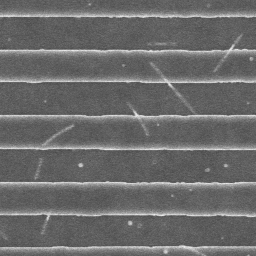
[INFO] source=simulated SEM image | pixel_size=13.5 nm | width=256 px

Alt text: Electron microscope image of lines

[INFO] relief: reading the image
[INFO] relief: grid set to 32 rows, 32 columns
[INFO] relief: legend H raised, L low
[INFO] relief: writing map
HHHHHHHHHHHHHHHHHHHHHHHHHHHHHHHH
HHHHHHHHHHHHHHHHHHHHHHHHHHHHHHHH
LLLLLLLLLLLLLLLLLLLLLLLLLLLLLLLL
LLLLLLLLLLLLLLLLLLLLLLLLLLLLLLLL
LLLLLLLLLLLLLLLLLLLLLLLLLLLLLLLL
LLLLLLLLLLLLLLLLLLLLLLLLLLLLLLLL
HHHHHHHHHHHHHHHHHHHHHHHHHHHHHHHH
HHHHHHHHHHHHHHHHHHHHHHHHHHHHHHHH
HHHHHHHHHHHHHHHHHHHHHHHHHHHHHHHH
HHHHHHHHHHHHHHHHHHHHHHHHHHHHHHHH
LLLLLLLLLLLLLLLLLLLLLLLLLLLLLLLL
LLLLLLLLLLLLLLLLLLLLLLLLLLLLLLLL
LLLLLLLLLLLLLLLLLLLLLLLLLLLLLLLL
LLLLLLLLLLLLLLLLLLLLLLLLLLLLLLLL
HHHHHHHHHHHLHHHHHHLHHHHHHHHHHHHH
HHHHHHHHHHHHHHHHHHHHHHHHHHHHHHHH
HHHHHHHHHHHHHHHHHHHHHHHHHHHHHHHH
HHHHHHHHHHHHHHHHHHHHHHHHHHHHHHHH
HHHHHHHHHHHHHHHHHHHHHHHHHHHHHHHH
LLLLLLLLLLLLLLLLLLLLLLLLLLLLLLLL
LLLLLLLLLLLLLLLLLLLLLLLLLLLLLLLL
LLLLLLLLLLLLLLLLLLLLLLLLLLLLLLLL
LLLLLLLLLLLLLLLLLLLLLLLLLLLLLLLL
HHHHHHHHHHHHHHHHHHHHHHHHHHHHHHHH
HHHHHHHHHHHHHHHHHHHHHHHHHHHHHHHH
HHHHHHHHHHHHHHHHHHHHHHHHHHHHHHHH
HHHHHHHHHHHHHHHHHHHHHHHHHHHHHHHH
LLLLLLLLLLLLLLLLLLLLLLLLLLLLLLLL
LLLLLLLLLLLLLLLLLLLLLLLLLLLLLLLL
LLLLLLLLLLLLLLLLLLLLLLLLLLLLLLLL
LLLLLLLLLLLLLLLLLLLLLLLLLLLLLLLL
HHHHHHHHHHHHHHHHHHHHHHHHHHHHHHHH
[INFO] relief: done